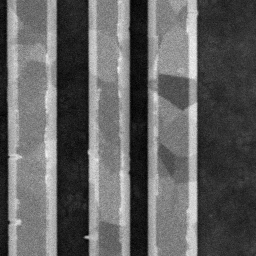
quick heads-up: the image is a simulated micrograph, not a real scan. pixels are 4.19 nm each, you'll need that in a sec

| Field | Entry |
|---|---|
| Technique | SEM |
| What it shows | one or a few lines or trenches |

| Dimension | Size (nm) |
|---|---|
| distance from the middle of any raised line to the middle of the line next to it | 293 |